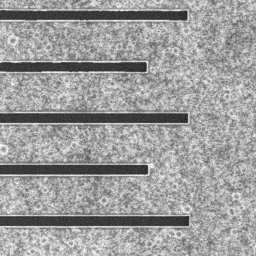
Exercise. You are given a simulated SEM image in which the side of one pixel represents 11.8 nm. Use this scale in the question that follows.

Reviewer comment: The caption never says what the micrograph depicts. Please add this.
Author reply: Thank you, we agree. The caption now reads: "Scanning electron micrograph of parallel lines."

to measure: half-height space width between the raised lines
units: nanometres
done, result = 133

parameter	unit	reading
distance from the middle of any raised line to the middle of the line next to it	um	0.605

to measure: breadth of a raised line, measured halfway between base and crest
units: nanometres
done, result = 476